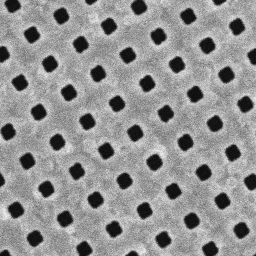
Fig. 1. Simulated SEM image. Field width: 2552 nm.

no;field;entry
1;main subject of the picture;a regular array of holes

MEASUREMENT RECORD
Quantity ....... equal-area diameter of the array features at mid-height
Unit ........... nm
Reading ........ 164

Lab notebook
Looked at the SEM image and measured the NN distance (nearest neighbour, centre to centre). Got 341 nm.